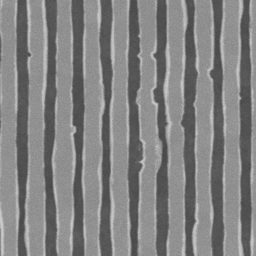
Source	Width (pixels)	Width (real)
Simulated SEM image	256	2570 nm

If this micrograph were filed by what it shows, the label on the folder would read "parallel lines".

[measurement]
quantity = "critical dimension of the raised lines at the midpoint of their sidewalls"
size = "163 nm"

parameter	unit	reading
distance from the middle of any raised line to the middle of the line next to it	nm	280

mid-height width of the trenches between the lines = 0.12 µm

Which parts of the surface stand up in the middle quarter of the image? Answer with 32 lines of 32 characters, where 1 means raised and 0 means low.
11000111100011110001111000111100
11000111100011110001111000111100
11000111100001110001111000111100
11000111100011110001111000111100
11000111100011110001111000111000
11000111110011110001111001111100
11000111110011110001110001111100
11000111110011110011110001111100
11000111110011110011110001111100
11000111110011110011111000111100
11000111110011110001111000111100
11000111110011110001111000111100
11000111100011110001111000111100
11000111100011110001111000111000
11000111100011110001111000111000
11000111100011110001111000111000
11100111100011110001111000111100
11000111100011110001111000111100
11000111100011110001111100111100
11000111100011110001111100111100
11000111100011110000111110111100
11100111110011110000111100011100
11100111110011110000111100011100
11100111100011110000111100011100
11100111100011110001111100111100
11100111100011110000111100111100
11100111100011110001111100111100
11000111100011110001111000111100
11000111100011110001111000111100
11000111100011110001111000111100
11000111100011110001111000111100
11000111100011110001111000111100